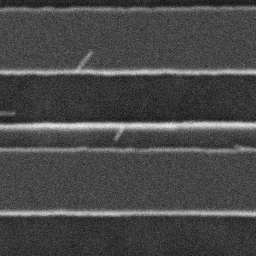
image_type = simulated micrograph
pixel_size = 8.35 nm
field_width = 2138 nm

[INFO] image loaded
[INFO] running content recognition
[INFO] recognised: lines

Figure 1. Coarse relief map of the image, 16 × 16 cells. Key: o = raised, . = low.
oooooooooooooooo
oooooooooooooooo
oooooooooooooooo
oooooooooooooooo
oooooooooooooooo
................
................
................
oooooooooooooooo
oooooooooooooooo
oooooooooooooooo
oooooooooooooooo
oooooooooooooooo
................
................
................